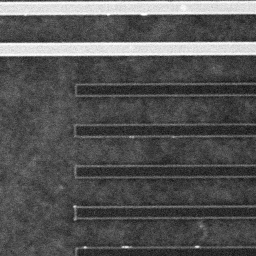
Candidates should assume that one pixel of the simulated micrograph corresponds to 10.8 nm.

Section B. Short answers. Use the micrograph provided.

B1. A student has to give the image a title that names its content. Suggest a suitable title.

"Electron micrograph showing parallel lines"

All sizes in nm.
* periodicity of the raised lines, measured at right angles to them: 441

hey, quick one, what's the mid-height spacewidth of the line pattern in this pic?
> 29.2 pixels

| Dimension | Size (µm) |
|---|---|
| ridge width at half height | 0.128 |